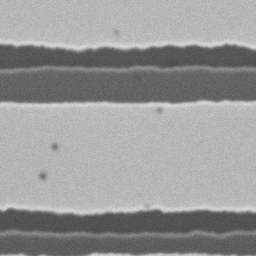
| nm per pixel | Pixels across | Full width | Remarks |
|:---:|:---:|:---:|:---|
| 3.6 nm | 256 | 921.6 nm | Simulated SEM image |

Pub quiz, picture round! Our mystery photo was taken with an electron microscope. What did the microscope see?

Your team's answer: lines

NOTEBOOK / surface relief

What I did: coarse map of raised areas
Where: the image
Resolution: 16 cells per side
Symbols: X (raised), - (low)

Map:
XXXXXXXXXXXXXXXX
XXXXXXXXXXXXXXXX
XXXXXXXXXXXXXXXX
----------------
----------------
----------------
XXXXXXXXXXXXXXXX
XXXXXXXXXXXXXXXX
XXXXXXXXXXXXXXXX
XXXXXXXXXXXXXXXX
XXXXXXXXXXXXXXXX
XXXXXXXXXXXXXXXX
XXXXXXXXXXXXXXXX
----------------
----------------
----------------